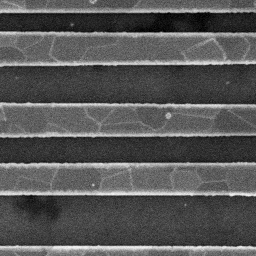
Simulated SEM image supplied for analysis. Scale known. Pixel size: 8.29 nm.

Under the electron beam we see lines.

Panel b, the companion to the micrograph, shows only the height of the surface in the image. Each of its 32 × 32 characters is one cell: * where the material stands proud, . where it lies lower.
********************************
*************************..*.*..
................................
................................
********************************
********************************
********************************
********************************
................................
................................
................................
................................
................................
********************************
********************************
********************************
********************************
................................
................................
................................
.*...*...**.********************
********************************
********************************
********************************
................................
................................
................................
................................
................................
................................
................................
********************************